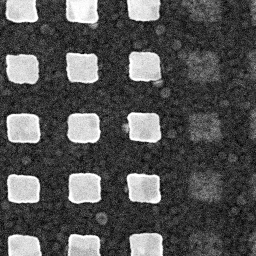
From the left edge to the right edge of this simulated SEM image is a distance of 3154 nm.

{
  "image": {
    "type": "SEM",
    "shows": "a regular array of raised bodies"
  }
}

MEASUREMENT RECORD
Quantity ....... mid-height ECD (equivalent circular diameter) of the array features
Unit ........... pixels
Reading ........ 32.2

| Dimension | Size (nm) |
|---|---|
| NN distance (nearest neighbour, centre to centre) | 733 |